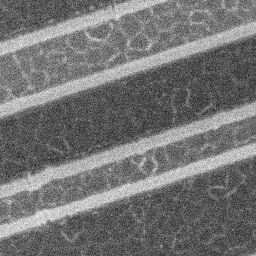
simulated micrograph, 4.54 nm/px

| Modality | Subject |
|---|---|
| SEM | one or a few lines or trenches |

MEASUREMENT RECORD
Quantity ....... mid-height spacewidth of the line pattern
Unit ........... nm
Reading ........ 348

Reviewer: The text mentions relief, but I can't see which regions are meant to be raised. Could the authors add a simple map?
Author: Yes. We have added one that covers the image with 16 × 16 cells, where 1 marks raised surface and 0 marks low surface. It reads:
0000000011111111
0000011111111111
0011111111111100
1111111111100000
1111111100000000
1111000000000000
1000000000000000
0000000000000011
0000000000011111
0000000011111110
0000011111110000
0011111110000000
1111110000000000
1110000000000000
0000000000000000
0000000000000000